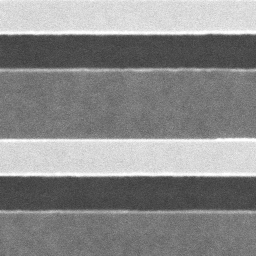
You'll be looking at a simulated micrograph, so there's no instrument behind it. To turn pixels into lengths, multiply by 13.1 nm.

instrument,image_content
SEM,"lines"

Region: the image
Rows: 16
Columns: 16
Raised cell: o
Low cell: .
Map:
oooooooooooooooo
oooooooooooooooo
................
................
oooooooooooooooo
oooooooooooooooo
oooooooooooooooo
oooooooooooooooo
oooooooooooooooo
oooooooooooooooo
oooooooooooooooo
................
................
oooooooooooooooo
oooooooooooooooo
oooooooooooooooo